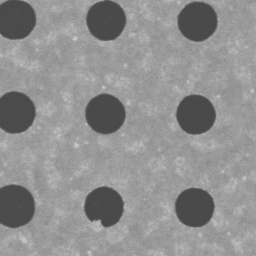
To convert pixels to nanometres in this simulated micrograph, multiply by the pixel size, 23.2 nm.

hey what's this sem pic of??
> holes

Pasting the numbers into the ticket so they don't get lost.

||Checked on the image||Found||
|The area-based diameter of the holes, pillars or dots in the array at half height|934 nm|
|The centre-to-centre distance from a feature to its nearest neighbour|2100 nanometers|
